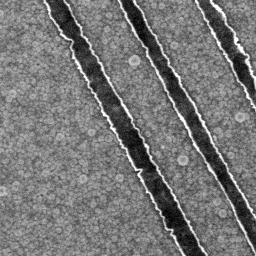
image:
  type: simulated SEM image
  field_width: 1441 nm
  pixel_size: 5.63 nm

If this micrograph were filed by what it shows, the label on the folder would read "one or a few lines or trenches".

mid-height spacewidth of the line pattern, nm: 256